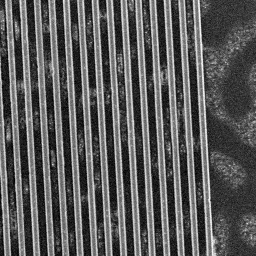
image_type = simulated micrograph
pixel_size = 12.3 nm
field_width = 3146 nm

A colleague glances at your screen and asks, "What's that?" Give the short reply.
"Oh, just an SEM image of parallel lines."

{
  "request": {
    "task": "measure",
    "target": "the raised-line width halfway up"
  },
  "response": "65.9 nanometres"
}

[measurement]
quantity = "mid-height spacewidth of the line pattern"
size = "0.112 um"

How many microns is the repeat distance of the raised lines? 0.177